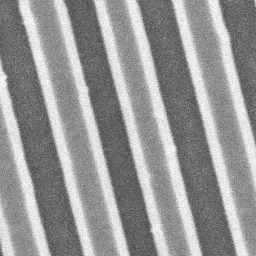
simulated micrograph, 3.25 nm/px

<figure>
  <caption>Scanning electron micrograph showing one or a few lines or trenches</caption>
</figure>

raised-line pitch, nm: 239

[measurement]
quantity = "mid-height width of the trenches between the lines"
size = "140 nm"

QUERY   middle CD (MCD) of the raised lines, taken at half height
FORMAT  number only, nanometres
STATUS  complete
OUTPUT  109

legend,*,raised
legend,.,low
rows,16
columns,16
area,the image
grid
..**..**...**...
..**...**..***..
..**...**...**..
..***..**...**..
...**..**...**..
...**...**...**.
...**...**...**.
*..***..**...**.
*...**..**...**.
*...**...**...**
*...**...**...**
**..***..**...**
**...**..**...**
**...**...**...*
**...**...**...*
***..***..**...*